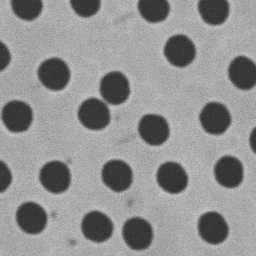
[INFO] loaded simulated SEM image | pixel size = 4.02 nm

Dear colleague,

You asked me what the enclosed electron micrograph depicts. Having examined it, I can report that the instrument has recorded a regular array of holes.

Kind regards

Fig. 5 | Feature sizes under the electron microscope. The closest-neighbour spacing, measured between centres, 0.207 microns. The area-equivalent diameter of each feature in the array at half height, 130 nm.